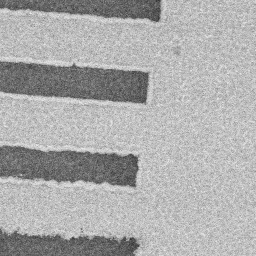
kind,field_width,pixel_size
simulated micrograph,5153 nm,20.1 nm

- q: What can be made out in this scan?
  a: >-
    one or a few lines or trenches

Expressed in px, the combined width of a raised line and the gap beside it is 84.4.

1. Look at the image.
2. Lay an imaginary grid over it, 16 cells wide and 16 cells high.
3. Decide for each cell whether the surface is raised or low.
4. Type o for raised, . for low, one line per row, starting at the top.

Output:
..........oooooo
oooooooooooooooo
oooooooooooooooo
oooooooooooooooo
.........ooooooo
.........ooooooo
ooooooo..ooooooo
oooooooooooooooo
oooooooooooooooo
........oooooooo
.........ooooooo
ooo......ooooooo
oooooooooooooooo
oooooooooooooooo
..oooooooooooooo
.........ooooooo